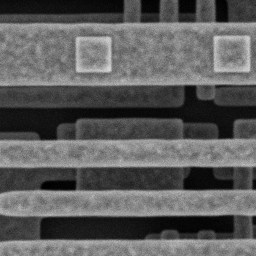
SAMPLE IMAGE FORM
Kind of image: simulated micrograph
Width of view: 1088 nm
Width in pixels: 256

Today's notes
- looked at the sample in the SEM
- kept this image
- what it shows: wiring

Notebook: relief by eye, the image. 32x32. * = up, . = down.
................*...............
................................
................................
********************************
********************************
********************************
********************************
********************************
********************************
********************************
********************************
.........................*......
................................
................................
................................
............*..*...*............
...............*..*.............
...............*.***........****
********************************
********************************
********************************
................................
...........**...................
.............**.................
********************************
********************************
********************************
................................
................................
................................
********************************
********************************